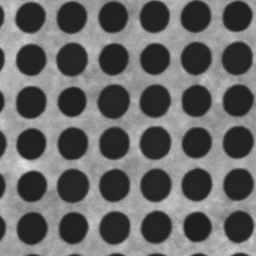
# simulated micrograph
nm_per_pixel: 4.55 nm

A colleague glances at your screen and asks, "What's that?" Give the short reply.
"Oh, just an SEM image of a regular array of holes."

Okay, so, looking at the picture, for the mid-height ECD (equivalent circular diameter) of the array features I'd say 31.9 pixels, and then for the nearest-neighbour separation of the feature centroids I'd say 187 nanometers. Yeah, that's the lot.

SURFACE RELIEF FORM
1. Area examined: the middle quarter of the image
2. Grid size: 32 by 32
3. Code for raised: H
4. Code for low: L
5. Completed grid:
LLLLLLHHHLLLLLLLHHHLLLLLLLHHHHLL
LLLLLHHHHLLLLLLHHHHHLLLLLHHHHHLL
LLLLHHHHHHHLLLHHHHHHHLLLHHHHHHHL
HHHHHHHHHHHHHHHHHHHHHHHHHHHHHHHH
HHHHHHHHHHHHHHHHHHHHHHHHHHHHHHHH
HHLHHHHHHHHLLLLHHHHHHLLLLHHHHHHH
LLLLHHHHHHLLLLLLHHHHLLLLLLHHHHLL
LLLLLHHHHLLLLLLLHHHLLLLLLLHHHHLL
LLLLLLHHHLLLLLLLHHHLLLLLLLLHHLLL
LLLLLLHHLLLLLLLLHHHLLLLLLLLHHLLL
LLLLLHHHLLLLLLLLHHHLLLLLLLHHHLLL
LLLLLHHHHLLLLLLLHHHLLLLLLLHHHHLL
LLLLHHHHHLLLLLLHHHHHLLLLLHHHHHHL
HHHHHHHHHHHLLLHHHHHHHHHHHHHHHHHH
HHHHHHHHHHHHHHHHHHHHHHHHHHHHHHHH
HHHHHHHHHHHHHHHHHHHHHHHHHHHHHHHH
LLLLLHHHHHHLLLLHHHHHLLLLLLHHHHHL
LLLLLHHHHHLLLLLLHHHLLLLLLLHHHHLL
LLLLLLHHHLLLLLLLHHHLLLLLLLLHHHLL
LLLLLLHHHLLLLLLLLHHLLLLLLLLHHLLL
LLLLLLHHHLLLLLLLHHHLLLLLLLLHHLLL
LLLLLLHHHLLLLLLLHHHLLLLLLLLHHHLL
LLLLLHHHHLLLLLLHHHHHLLLLLLHHHHHL
LLLLHHHHHHLLLLHHHHHHHLLLLHHHHHHH
HHHHHHHHHHHHHHHHHHHHHHHHHHHHHHHH
HHHHHHHHHHHHHHHHHHHHHHHHHHHHHHHH
HLLLHHHHHHHLLLHHHHHHHLLLLHHHHHHH
LLLLLHHHHHLLLLLHHHHHLLLLLLHHHHLL
LLLLLLHHHLLLLLLLHHHLLLLLLLLHHHLL
LLLLLLHHHLLLLLLLHHHLLLLLLLLHHLLL
LLLLLLHHHLLLLLLLLHHLLLLLLLLHHLLL
LLLLLLHHHLLLLLLLHHHLLLLLLLLHHHLL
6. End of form